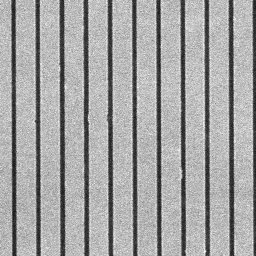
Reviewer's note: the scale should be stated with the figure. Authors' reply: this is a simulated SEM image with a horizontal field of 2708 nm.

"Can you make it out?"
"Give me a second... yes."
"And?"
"parallel lines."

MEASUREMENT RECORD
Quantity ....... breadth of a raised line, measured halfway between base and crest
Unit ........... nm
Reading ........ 198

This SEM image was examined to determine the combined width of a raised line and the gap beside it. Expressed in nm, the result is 256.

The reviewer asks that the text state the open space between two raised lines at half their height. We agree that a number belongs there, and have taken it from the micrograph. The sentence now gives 56.9 nanometers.